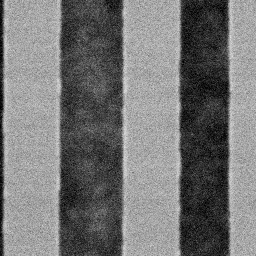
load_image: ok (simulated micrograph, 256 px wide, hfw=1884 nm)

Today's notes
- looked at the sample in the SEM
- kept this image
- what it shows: lines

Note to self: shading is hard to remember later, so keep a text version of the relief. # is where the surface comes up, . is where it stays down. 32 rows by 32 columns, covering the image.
.######.........######.......###
.######.........######.......###
.######.........######.......###
.######.........######.......###
.######.........######.......###
.######.........######.......###
.######.........######.......###
.######.........######.......###
.######.........######.......###
.######.........######.......###
.######.........######.......###
.######.........######.......###
.######.........######.......###
.######.........######.......###
#######.........######.......###
#######.........######.......###
#######.........######.......###
.######.........######.......###
.######.........######.......###
.######.........######.......###
.######.........######.......###
.######.........######.......###
.######.........######.......###
.######.........######.......###
.######.........######.......###
.######.........######.......###
.######.........######.......###
#######.........######.......###
#######........#######.......###
.######.........######.......###
.######........#######.......###
.######........#######.......###